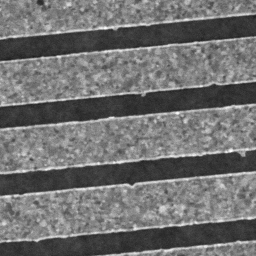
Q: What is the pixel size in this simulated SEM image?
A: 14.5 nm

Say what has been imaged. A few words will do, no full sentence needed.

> one or a few lines or trenches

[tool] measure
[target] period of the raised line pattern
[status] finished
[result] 982 nanometers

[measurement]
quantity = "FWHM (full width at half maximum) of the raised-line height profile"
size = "643 nm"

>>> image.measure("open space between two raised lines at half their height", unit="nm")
341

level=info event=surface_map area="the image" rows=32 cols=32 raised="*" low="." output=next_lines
********************************
********************************
**********************..........
*************...................
**..............................
........................********
.............*******************
...*****************************
********************************
********************************
**************************......
******************..............
*******.........................
............................****
..................**************
........************************
********************************
********************************
********************************
**********************..........
************....................
*...............................
.......................*********
.............*******************
..******************************
********************************
********************************
****************************....
******************..............
********........................
.............................***
...................*************